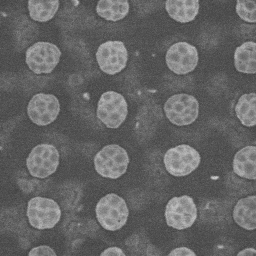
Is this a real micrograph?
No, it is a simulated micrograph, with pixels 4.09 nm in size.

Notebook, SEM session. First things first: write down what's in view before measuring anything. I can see a regular array of raised bodies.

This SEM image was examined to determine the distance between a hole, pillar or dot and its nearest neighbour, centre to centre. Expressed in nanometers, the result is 211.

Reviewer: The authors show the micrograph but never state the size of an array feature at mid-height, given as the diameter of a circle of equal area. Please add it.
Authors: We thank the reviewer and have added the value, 128 nm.